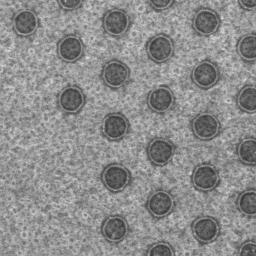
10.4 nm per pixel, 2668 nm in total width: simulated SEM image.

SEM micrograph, a regular array of raised bodies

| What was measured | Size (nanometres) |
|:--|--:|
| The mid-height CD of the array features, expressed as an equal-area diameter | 248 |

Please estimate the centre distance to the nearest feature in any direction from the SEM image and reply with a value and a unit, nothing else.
535 nm